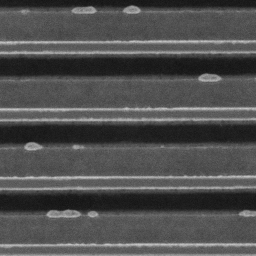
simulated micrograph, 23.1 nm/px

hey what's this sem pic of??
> lines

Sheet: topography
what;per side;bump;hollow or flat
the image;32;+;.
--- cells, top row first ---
................................
..++.....+++++.+++++++++++++++++
++++++++++++++++++++++++++++++++
++++++++++++++++++++++++++++++++
++++++++++++++++++++++++++++++++
++++++++++++++++++++++++++++++++
++++++++++++++++++++++++++++++++
................................
................................
.........................++.....
++++++++++++++++++++++++++++++++
++++++++++++++++++++++++++++++++
++++++++++++++++++++++++++++++++
++++++++++++++++++++++++++++++++
++++++++++++++++++++++++++++++++
................................
................................
................................
...+++...++.........++++++++++++
++++++++++++++++++++++++++++++++
++++++++++++++++++++++++++++++++
++++++++++++++++++++++++++++++++
++++++++++++++++++++++++++++++++
++++++++++++++++++++++++++++++++
................................
................................
......++++.+..................++
++++++++++++++++++++++++++++++++
++++++++++++++++++++++++++++++++
++++++++++++++++++++++++++++++++
++++++++++++++++++++++++++++++++
++++++++++++++++++++++++++++++++